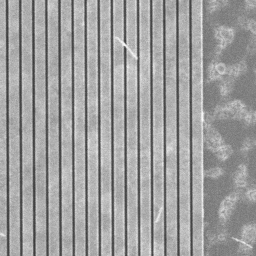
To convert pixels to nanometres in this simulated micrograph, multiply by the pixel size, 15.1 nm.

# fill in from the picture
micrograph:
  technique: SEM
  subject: parallel lines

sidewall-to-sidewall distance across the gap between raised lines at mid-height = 49.1 nanometres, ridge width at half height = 149 nm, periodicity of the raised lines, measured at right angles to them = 198 nm